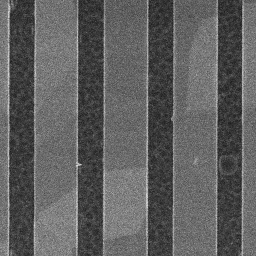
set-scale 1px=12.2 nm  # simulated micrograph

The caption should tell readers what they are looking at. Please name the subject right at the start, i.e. one or a few lines or trenches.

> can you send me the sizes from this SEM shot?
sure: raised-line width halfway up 529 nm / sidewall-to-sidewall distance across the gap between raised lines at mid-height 321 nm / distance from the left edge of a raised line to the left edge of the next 852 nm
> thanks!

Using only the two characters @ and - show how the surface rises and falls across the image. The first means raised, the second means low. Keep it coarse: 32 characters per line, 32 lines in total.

@@--@@@@@@---@@@@@----@@@@@---@@
@---@@@@@@---@@@@@----@@@@@---@@
@---@@@@@@---@@@@@----@@@@@---@@
@---@@@@@@---@@@@@----@@@@@---@@
@---@@@@@@@--@@@@@----@@@@@---@@
@---@@@@@@---@@@@@----@@@@@---@@
@---@@@@@@---@@@@@----@@@@@---@@
@---@@@@@@---@@@@@----@@@@@---@@
@---@@@@@@---@@@@@----@@@@@---@@
@---@@@@@@---@@@@@----@@@@@---@@
@---@@@@@@---@@@@@----@@@@@---@@
@---@@@@@@---@@@@@----@@@@@---@@
@---@@@@@@---@@@@@----@@@@@---@@
@---@@@@@@---@@@@@----@@@@@---@@
@---@@@@@@---@@@@@----@@@@@---@@
@---@@@@@@---@@@@@----@@@@@---@@
@---@@@@@@---@@@@@----@@@@@---@@
@---@@@@@@---@@@@@----@@@@@---@@
@---@@@@@@---@@@@@----@@@@@---@@
@---@@@@@@---@@@@@----@@@@@---@@
@---@@@@@@---@@@@@----@@@@@@@@@@
@---@@@@@@---@@@@@----@@@@@-@-@@
@---@@@@@@---@@@@@----@@@@@---@@
@---@@@@@@---@@@@@----@@@@@---@@
@---@@@@@@---@@@@@----@@@@@---@@
@---@@@@@@---@@@@@----@@@@@---@@
@---@@@@@@---@@@@@----@@@@@---@@
@---@@@@@@---@@@@@----@@@@@---@@
@---@@@@@@---@@@@@----@@@@@---@@
@---@@@@@@---@@@@@----@@@@@---@@
@---@@@@@@---@@@@@----@@@@@---@@
@---@@@@@@---@@@@@----@@@@@---@@